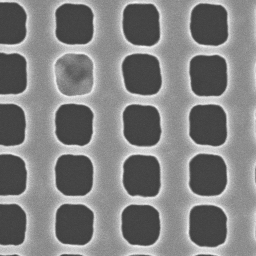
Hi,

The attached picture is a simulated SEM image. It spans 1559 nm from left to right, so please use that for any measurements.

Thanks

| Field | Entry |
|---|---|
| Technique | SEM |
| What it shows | a regular array of holes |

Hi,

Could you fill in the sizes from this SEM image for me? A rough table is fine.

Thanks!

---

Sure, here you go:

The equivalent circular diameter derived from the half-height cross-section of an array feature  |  258 nanometres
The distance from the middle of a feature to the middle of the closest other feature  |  305 nm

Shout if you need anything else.